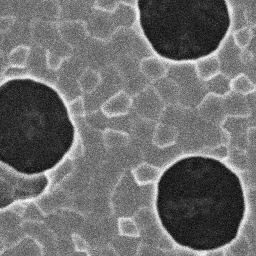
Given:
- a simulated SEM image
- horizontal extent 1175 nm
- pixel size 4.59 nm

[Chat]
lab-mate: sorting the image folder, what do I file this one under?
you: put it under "holes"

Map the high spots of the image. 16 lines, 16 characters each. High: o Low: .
ooooooooo.....oo
ooooooooo.....oo
ooooooooo.....oo
oooooooooo...ooo
oooooooooooooooo
...ooooooooooooo
....oooooooooooo
....oooooooooooo
.....ooooooooooo
....oooooooooooo
o..oooooooo...oo
oooooooooo.....o
oooooooooo.....o
oooooooooo.....o
oooooooooo.....o
oooooooooooo..oo